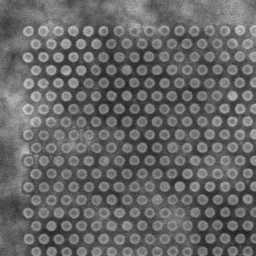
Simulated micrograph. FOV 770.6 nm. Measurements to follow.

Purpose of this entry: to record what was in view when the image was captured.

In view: a regular array of raised bodies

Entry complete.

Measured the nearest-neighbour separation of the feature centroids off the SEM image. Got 44.4 nanometres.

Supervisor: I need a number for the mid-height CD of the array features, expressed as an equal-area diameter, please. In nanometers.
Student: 29.2